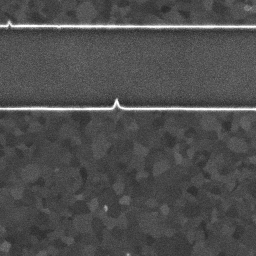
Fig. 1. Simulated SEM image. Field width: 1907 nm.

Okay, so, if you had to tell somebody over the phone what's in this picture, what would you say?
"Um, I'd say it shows one or a few lines or trenches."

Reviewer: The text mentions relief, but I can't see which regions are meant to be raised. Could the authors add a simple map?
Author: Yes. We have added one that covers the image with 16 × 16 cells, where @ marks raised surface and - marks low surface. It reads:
@@@@@@@@@@@@@@@@
@@@@@@@@@@@@@@@@
----------------
----------------
----------------
----------------
----------------
@@@@@@@@@@@@@@@@
@@@@@@@@@@@@@@@@
@@@@@@@@@@@@@@@@
@@@@@@@@@@@@@@@@
@@@@@@@@@@@@@@@@
@@@@@@@@@@@@@@@@
@@@@@@@@@@@@@@@@
@@@@@@@@@@@@@@@@
@@@@@@@@@@@@@@@@